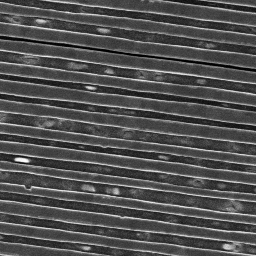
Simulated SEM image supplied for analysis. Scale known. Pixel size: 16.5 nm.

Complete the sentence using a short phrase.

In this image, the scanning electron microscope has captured parallel lines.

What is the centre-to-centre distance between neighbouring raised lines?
328 nm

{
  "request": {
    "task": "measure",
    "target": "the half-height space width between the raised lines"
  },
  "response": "9.29 px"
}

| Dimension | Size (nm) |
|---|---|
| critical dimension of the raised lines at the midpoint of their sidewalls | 184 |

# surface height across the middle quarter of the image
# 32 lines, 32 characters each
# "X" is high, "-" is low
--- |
-------------XXXXXXXXXXXXXXXXXXX
---------------------XXXXXXXXXXX
XXXXXX-------------------------X
XXXXXXXXXXXXXX------------------
---XXXXXXXXXXXXXXXXXX-----------
----------XXXXXXXXXXXXXXXXXXXXXX
XXX--------------XXXXXXXXXXXXXXX
XXXXXXXXXX----------------XXXXXX
XXXXXXXXXXXXXXXXXXXX------------
---XXXXXXXXXXXXXXXXXXXXXXXXX----
-----------XXXXXXXXXXXXXXXXXXXXX
XXX------------------XXXXXXXXXXX
XXXXXXXXXXX----------------XXXXX
XXXXXXXXXXXXXXXXXXX-------------
-----XXXXXXXXXXXXXXXXXXXXXXX----
------------XXXXXXXXXXXXXXXXXXXX
------------------XXXXXXXXXXXXXX
XXXX----------------------XXXXXX
XXXXXXXXXXX---------------------
-XXXXXXXXXXXXXXXXXXX------------
---------XXXXXXXXXXXXXXXXXXX----
XX-----------------XXXXXXXXXXXXX
XXXXXXXXX------------------XXXXX
XXXXXXXXXXXXXXXXX---------------
------XXXXXXXXXXXXXXXXXXX-------
------------XXXXXXXXXXXXXXXXXXXX
--------------------XXXXXXXXXXXX
XXXXXXXX--------------------XXXX
XXXXXXXXXXXXXXX-----------------
-------X-XXXXXXXXXXXXX----------
----------------XXXXXXXXXXXXX---
------------------------XXXXXXXX